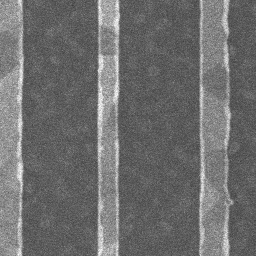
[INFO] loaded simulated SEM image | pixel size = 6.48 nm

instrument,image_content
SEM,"one or a few lines or trenches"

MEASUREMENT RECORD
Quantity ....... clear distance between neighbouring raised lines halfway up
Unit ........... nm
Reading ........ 522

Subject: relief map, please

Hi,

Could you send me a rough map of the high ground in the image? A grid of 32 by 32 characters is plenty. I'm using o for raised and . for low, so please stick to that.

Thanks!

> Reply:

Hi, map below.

ooo.........ooo..........oooo...
ooo.........ooo..........ooo....
ooo.........ooo..........ooo....
ooo.........ooo..........ooo....
ooo.........ooo..........ooo....
ooo.........ooo..........ooo....
ooo.........ooo..........ooo....
ooo.........ooo..........ooo....
ooo.........ooo..........oooo...
ooo.........ooo..........oooo...
ooo.........ooo..........oooo...
ooo.........ooo..........oooo...
ooo.........ooo..........oooo...
ooo.........ooo..........oooo...
ooo.........ooo..........oooo...
ooo.........ooo..........oooo...
ooo.........ooo..........ooo....
ooo.........ooo..........ooo....
oo..........ooo..........ooo....
ooo.........ooo..........ooo....
ooo.........ooo..........ooo....
ooo.........ooo..........ooo....
ooo.........ooo..........ooo....
ooo.........ooo..........ooo....
ooo.........ooo..........oooo...
ooo.........ooo..........oooo...
ooo.........ooo..........ooo....
ooo.........ooo..........ooo....
ooo.........ooo..........ooo....
ooo.........ooo..........ooo....
ooo.........ooo..........ooo....
ooo.........ooo..........oooo...